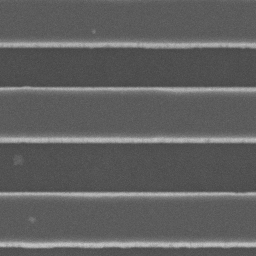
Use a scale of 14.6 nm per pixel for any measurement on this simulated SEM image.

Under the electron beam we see lines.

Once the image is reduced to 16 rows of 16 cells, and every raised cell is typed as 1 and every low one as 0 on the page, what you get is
1111111111111111
1111111111111111
1111111111111111
0000000000000000
0000000000000000
1111111011100000
1111111111111111
1111111111111111
1111111111111111
0000000000000000
0000000000000000
0000000000000000
1111111111111111
1111111111111111
1111111111111111
0000000000000000